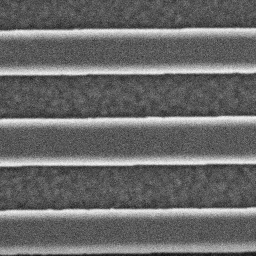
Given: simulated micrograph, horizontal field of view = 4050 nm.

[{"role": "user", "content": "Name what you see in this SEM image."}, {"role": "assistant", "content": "lines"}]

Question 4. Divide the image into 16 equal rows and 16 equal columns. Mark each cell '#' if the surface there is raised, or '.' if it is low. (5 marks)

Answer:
................
................
################
################
############....
................
................
.###############
################
################
................
................
................
################
################
################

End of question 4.